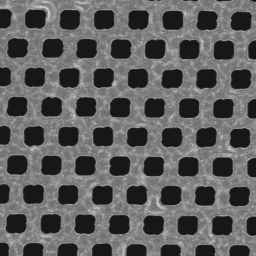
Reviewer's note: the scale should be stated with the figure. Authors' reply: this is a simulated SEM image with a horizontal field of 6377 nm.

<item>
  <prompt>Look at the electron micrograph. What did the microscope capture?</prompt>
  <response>a regular array of holes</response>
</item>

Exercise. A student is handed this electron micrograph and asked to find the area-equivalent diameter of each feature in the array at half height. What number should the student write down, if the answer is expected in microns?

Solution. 0.541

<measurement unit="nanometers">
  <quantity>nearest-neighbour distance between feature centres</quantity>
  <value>838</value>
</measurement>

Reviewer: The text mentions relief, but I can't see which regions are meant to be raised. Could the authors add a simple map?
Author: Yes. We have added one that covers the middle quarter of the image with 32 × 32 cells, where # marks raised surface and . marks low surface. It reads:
################################
....####....#####....####....###
....###......###.....###......##
....###......###.....###......##
....###.....####.....###......##
...#####....####.....###.....###
################################
################################
####....#####.#########.######..
###.....####.....###.....####...
###.....####.....###.....####...
###.....###......###.....####...
###.....####....####.....####...
#####################...######..
################################
################################
....###.....####.....####....###
....###.....####.....###......##
....###.....####.....###......##
....###.....####.....###.....###
...#####...#####....#####....###
################################
################################
###.....####....#####...######..
###.....###......###.....####...
###.....###......###.....###....
###.....###......###.....###....
###....#####....####.....####...
################################
################################
...#####....#####...######..####
....###.....####.....###.....###